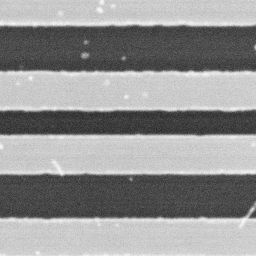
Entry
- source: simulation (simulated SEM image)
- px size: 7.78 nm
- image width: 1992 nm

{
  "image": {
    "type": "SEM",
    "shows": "lines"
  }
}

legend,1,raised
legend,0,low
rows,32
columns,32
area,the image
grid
11111111111111111111111111111111
11111111111111111111111111111111
11111111111111111111111111111111
00000000000000000000000000000000
00000000000000000000000000000000
00000000000000000000000000000000
00000000000000000000000000000000
00000000000000000000000000000000
00000000000000000000000000000000
11111111111111111111111111111111
11111111111111111111111111111111
11111111111111111111111111111111
11111111111111111111111111111111
11111111111111111111111111111111
00000000000000000000000000000000
00000000000000000000000000000000
00000000000000000000000000000000
11111111111111111111111111111111
11111111111111111111111111111111
11111111111111111111111111111111
11111111111111111111111111111111
11111111111111111111111111111111
00000000000000000000000000000000
00000000000000000000000000000000
00000000000000000000000000000000
00000000000000000000000000000000
00000000000000000000000000000000
11111111111111111111111111111111
11111111111111111111111111111111
11111111111111111111111111111111
11111111111111111111111111111111
11111111111111111111111111111111